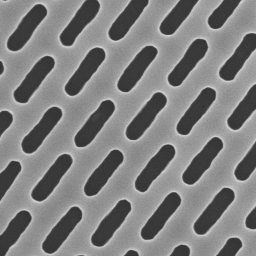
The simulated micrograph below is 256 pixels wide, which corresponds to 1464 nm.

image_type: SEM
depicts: a regular array of holes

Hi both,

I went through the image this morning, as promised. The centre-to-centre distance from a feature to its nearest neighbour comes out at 283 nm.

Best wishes